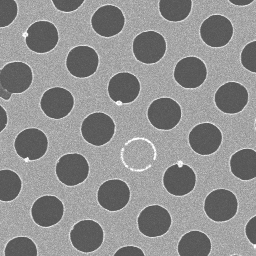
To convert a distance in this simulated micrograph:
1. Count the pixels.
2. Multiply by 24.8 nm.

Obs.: a regular array of holes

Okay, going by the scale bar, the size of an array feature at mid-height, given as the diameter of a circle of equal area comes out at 0.808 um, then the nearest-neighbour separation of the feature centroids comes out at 1190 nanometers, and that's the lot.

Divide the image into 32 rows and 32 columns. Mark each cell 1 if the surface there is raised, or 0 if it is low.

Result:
00111110001111111111000011111001
00111111111100011111000011111111
00111111111000001111100111000111
11110001111100011111111110000111
11100001111110111000111110000111
11100001111111111000011111001110
11110011100011111000011111111100
11111111000011111000111001111100
00001111000011111111110000111110
00001111100111000111110000111111
00001111111111000111110001110011
00011100011111000111111111100001
11111000011111000110001111100001
11111000011111111110000111100011
01111100111000111100000111111111
01111111110000111110001110111111
11100111110000111111111100001111
11000011111000111111111100001111
11000011111111111111111100011111
11100111001111111111111111111000
11111110000111111111111111111000
00111110000111111111100011111000
00011110000111011111000011111101
00011111111100001111100011111111
00111111111100001111111111000111
11110000111110001111111111000011
11110000111111111100011111000011
11110000111111111000011111101110
11111111100001111000011111111110
11111111100001111100111000111110
10001111100001111111110000111111
10000111110111100011110000111111